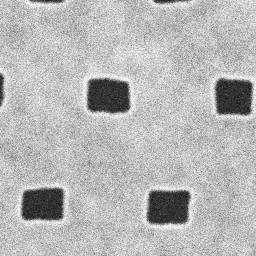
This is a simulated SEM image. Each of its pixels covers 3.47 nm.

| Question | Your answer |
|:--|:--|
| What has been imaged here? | holes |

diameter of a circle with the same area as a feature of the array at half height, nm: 146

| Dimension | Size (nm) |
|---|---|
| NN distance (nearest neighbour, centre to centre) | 435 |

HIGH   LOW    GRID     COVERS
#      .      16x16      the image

################
################
################
################
################
#####...#####...
#####...#####...
################
################
################
################
################
#...#####...####
#...#####...####
################
################